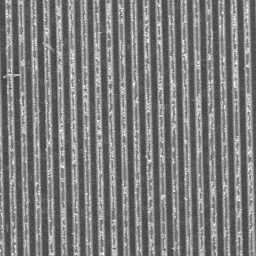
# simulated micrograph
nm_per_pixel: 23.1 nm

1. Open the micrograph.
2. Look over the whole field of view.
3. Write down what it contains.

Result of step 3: parallel lines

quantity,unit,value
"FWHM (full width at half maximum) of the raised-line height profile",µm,0.121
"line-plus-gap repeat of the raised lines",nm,289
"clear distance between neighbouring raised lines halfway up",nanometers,162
